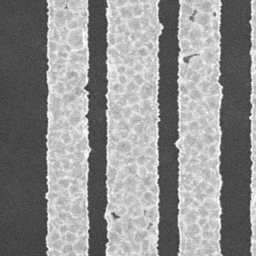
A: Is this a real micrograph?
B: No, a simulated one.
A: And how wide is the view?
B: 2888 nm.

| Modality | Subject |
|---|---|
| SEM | one or a few lines or trenches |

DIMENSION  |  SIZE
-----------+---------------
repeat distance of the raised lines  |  740 nm